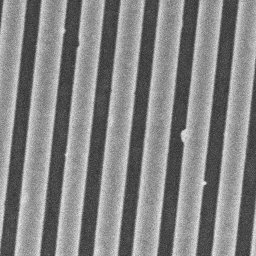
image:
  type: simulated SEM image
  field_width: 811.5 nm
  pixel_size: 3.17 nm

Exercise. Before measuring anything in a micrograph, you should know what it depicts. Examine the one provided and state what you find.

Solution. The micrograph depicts parallel lines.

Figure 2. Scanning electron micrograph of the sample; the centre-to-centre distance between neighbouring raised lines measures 124 nm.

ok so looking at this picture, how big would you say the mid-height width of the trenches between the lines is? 0.0485 um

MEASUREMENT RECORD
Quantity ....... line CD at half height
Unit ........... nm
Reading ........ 75.3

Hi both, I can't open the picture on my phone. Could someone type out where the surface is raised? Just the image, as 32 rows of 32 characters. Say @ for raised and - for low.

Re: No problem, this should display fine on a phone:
@@@--@@@--@@@--@@@--@@@--@@@--@@
@@@--@@@--@@@--@@@--@@@--@@@--@@
@@@--@@@--@@@--@@@--@@@--@@@--@@
@@@--@@@--@@@--@@@--@@@--@@--@@@
@@@--@@@--@@@--@@@--@@@-@@@--@@@
@@@--@@@--@@@--@@--@@@--@@@--@@@
@@@--@@@--@@--@@@--@@@--@@@--@@@
@@@-@@@@--@@--@@@--@@@--@@@--@@@
@@--@@@--@@@--@@@--@@@--@@@--@@@
@@--@@@--@@@--@@@--@@@--@@@--@@@
@@--@@@--@@@--@@@--@@@--@@@--@@@
@@--@@@--@@@--@@@--@@@--@@@--@@-
@@--@@@--@@@--@@@--@@@--@@---@@-
@@--@@@--@@@--@@@-@@@@--@@--@@@-
@@--@@@--@@@--@@@-@@@--@@@--@@@-
@@--@@@--@@--@@@--@@@--@@@--@@@-
@@--@@@--@@--@@@--@@@--@@@--@@@-
@--@@@--@@@--@@@--@@@--@@@--@@@-
@--@@@--@@@--@@@--@@@--@@@--@@@-
@--@@@--@@@--@@@--@@@--@@@--@@@-
@--@@@--@@@--@@@--@@@--@@@--@@@-
@--@@@--@@@--@@@--@@@--@@@--@@--
@--@@@--@@@--@@@--@@@--@@@-@@@--
@--@@@--@@@--@@@--@@--@@@--@@@--
@--@@@--@@--@@@--@@@--@@@--@@@--
@--@@@--@@--@@@--@@@--@@@--@@@--
--@@@@-@@@--@@@--@@@--@@@--@@@--
--@@@--@@@--@@@--@@@--@@@--@@@--
--@@@--@@@--@@@--@@@--@@@--@@@--
--@@@--@@@--@@@--@@@--@@@--@@@--
--@@@--@@@--@@@--@@@--@@@--@@---
--@@@--@@@--@@@--@@@--@@@--@@--@